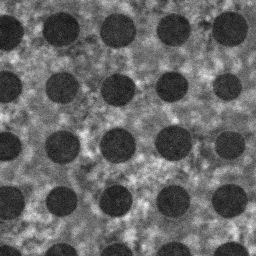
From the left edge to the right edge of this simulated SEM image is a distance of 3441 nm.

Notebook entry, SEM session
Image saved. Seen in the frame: a regular array of raised bodies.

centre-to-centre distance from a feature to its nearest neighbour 746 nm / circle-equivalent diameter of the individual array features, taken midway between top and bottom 477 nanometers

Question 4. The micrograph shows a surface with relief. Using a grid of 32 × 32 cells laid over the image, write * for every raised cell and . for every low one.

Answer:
................................
.......*....................*...
**....****...****...****...****.
***..*****..*****...****..*****.
***..*****..*****...****...****.
**....***....***....***....***..
.*..............................
................................
................................
**....***.....**....***....***..
***...****...****..*****...***..
***...****...****..****....***..
**....***....****...***.....*...
................................
................................
................................
*......**....***....****....**..
***...****..*****..*****...****.
***...****..*****..*****...****.
**....****...****...***....***..
.......**.....*.................
................................
................................
**.....**....***....***....***..
***...****..*****...****..*****.
***...****..*****..*****..*****.
***...***....***....***....***..
**..............................
................................
................................
.......**.....**....***.....**..
***...****...****...****...****.